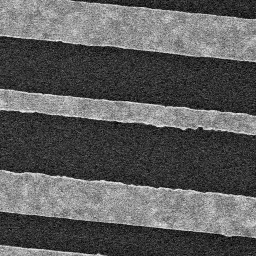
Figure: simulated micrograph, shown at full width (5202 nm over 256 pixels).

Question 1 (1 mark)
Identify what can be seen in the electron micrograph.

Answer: one or a few lines or trenches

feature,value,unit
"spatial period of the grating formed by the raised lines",1810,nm